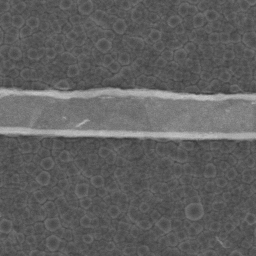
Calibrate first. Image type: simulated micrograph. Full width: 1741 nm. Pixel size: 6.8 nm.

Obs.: one or a few lines or trenches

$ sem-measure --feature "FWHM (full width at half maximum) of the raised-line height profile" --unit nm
268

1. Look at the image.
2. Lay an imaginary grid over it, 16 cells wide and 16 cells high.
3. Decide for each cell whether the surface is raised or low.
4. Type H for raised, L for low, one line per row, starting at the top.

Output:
LLLLLLLLLLLLLLLL
LLLLLLLLLLLLLLLL
LLLLLLLLLLLLLLLL
LLLLLLLLLLLLLLLL
LLLLLLLLLLLLLLLL
LLLLLLLLLLLLLLLL
HHHHHHHHHHHHHHHH
HHHHHHHHHHHHHHHH
LLLLLLLLLLLHHHHH
LLLLLLLLLLLLLLLL
LLLLLLLLLLLLLLLL
LLLLLLLLLLLLLLLL
LLLLLLLLLLLLLLLL
LLLLLLLLLLLLLLLL
LLLLLLLLLLLLLLLL
LLLLLLLLLLLLLLLL